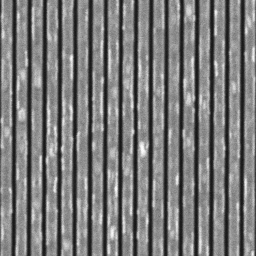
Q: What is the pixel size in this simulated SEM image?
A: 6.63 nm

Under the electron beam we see parallel lines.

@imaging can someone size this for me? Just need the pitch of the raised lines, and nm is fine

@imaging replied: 101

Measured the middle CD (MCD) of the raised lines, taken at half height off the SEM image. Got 0.068 µm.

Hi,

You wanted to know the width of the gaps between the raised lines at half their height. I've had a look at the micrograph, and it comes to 0.034 um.